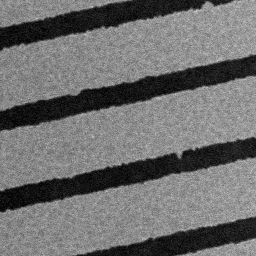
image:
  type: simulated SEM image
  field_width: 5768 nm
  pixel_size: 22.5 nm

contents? one or a few lines or trenches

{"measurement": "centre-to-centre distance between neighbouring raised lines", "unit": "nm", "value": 1780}